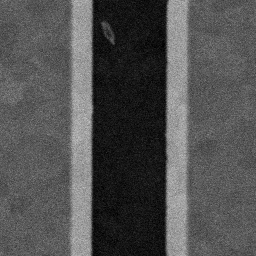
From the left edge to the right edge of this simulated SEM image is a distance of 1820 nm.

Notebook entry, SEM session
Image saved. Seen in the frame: one or a few lines or trenches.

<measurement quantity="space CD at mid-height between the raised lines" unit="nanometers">667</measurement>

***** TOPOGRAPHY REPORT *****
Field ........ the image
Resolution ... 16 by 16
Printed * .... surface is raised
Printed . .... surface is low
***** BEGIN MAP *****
*****......*****
*****......*****
*****......*****
*****......*****
*****......*****
*****......*****
*****......*****
*****......*****
*****......*****
*****......*****
*****......*****
*****......*****
*****......*****
*****......*****
*****......*****
*****......*****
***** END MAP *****